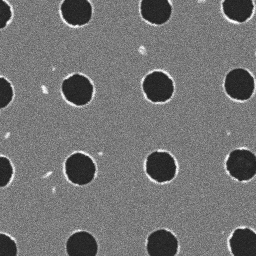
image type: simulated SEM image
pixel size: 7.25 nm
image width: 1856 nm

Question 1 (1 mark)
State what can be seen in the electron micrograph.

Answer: holes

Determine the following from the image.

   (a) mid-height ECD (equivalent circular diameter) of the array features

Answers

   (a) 226 nanometres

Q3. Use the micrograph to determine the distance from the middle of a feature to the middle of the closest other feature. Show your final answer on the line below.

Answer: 79.8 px